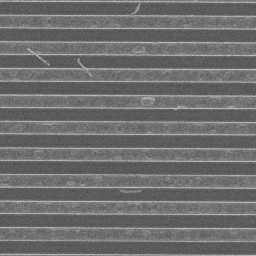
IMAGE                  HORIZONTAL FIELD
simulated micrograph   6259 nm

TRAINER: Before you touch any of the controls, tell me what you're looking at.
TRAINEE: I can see parallel lines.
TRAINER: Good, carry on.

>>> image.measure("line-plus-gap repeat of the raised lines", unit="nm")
649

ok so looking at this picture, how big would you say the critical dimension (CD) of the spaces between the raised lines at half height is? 0.339 micrometres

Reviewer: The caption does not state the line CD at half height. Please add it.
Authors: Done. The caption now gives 318 nm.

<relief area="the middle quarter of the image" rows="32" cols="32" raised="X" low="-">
--------------------------------
XXXXXXXXXXXXXXXXXXXXXXXXXXXXXXXX
XXXXXXXXXXXXXXXXXXXXXXXXXXXXXXXX
XXXXXXXXXXXXXXXXXXXXXXXXXXXXXXXX
--------------------------------
--------------------------------
--------------------------------
--------------------------------
XXXXXXXXXXXXXXXXXXXXXXXXXXXXXXXX
XXXXXXXXXXXXXXXXXXXXXXXXXXXXXXXX
XXXXXXXXXXXXXXXXXXXXXXXXXXXXXXXX
--------------------------------
--------------------------------
--------------------------------
--------------------------------
XXXXXXXXXXXXXXXXXXXXXXXXXXXXXXXX
XXXXXXXXXXXXXXXXXXXXXXXXXXXXXXXX
XXXXXXXXXXXXXXXXXXXXXXXXXXXXXXXX
--------------------------------
--------------------------------
--------------------------------
XXXXXXXXXXXXXXXXXXXXXXXXXXXXXXXX
XXXXXXXXXXXXXXXXXXXXXXXXXXXXXXXX
XXXXXXXXXXXXXXXXXXXXXXXXXXXXXXXX
--------------------------------
--------------------------------
--------------------------------
--------------------------------
XXXXXXXXXXXXXXXXXXXXXXXXXXXXXXXX
XXXXXXXXXXXXXXXXXXXXXXXXXXXXXXXX
XXXXXXXXXXXXXXXXXXXXXXXXXXXXXXXX
--------------------------------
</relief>